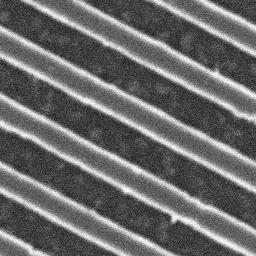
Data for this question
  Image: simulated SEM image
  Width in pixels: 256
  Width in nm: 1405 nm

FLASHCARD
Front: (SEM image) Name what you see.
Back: parallel lines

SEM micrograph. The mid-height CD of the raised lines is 135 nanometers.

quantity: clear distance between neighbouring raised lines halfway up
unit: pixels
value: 35.9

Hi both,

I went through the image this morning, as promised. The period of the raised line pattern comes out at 330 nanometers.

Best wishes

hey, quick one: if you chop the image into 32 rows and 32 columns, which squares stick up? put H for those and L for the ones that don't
LLLLHHHHHHLLLLLLLLLLHHHHHHLLLLLL
LLLLLLHHHHHHLLLLLLLLLLHHHHHHLLLL
LLLLLLLLHHHHHHLLLLLLLLLLHHHHHHLL
LLLLLLLLLLHHHHHHLLLLLLLLLLHHHHHH
HHLLLLLLLLLLHHHHHHLLLLLLLLLLHHHH
HHHHLLLLLLLLLHHHHHHHLLLLLLLLLHHH
HHHHHHLLLLLLLLLHHHHHHHLLLLLLLLLH
LHHHHHHHLLLLLLLLLHHHHHHHLLLLLLLL
LLLHHHHHHLLLLLLLLLLHHHHHHLLLLLLL
LLLLLHHHHHHLLLLLLLLLLHHHHHHLLLLL
LLLLLLLHHHHHHLLLLLLLLLLHHHHHHLLL
LLLLLLLLHHHHHHHLLLLLLLLLLHHHHHHL
HLLLLLLLLLHHHHHHHLLLLLLLLLLHHHHH
HHHLLLLLLLLLHHHHHHHLLLLLLLLLLHHH
HHHHHLLLLLLLLLHHHHHHHLLLLLLLLLHH
HHHHHHHLLLLLLLLLHHHHHHLLLLLLLLLL
LLHHHHHHHLLLLLLLLLHHHHHHHLLLLLLL
LLLLHHHHHHLLLLLLLLLLHHHHHHLLLLLL
LLLLLLHHHHHHLLLLLLLLLLHHHHHHLLLL
LLLLLLLLHHHHHHLLLLLLLLLLHHHHHHLL
LLLLLLLLLLHHHHHHLLLLLLLLLLHHHHHH
HHLLLLLLLLLHHHHHHHLLLLLLLLLHHHHH
HHHHLLLLLLLLLHHHHHHHLLLLLLLLLHHH
HHHHHHLLLLLLLLLHHHHHHHLLLLLLLLLH
LHHHHHHHLLLLLLLLLHHHHHHLLLLLLLLL
LLLHHHHHHLLLLLLLLLLHHHHHHLLLLLLL
LLLLLHHHHHHHLLLLLLLLLHHHHHHHLLLL
LLLLLLLHHHHHHLLLLLLLLLLHHHHHHLLL
LLLLLLLLLHHHHHHLLLLLLLLLLHHHHHHL
HLLLLLLLLLLHHHHHHLLLLLLLLLHHHHHH
HHHLLLLLLLLLHHHHHHHLLLLLLLLLHHHH
HHHHHLLLLLLLLLHHHHHHHLLLLLLLLLHH